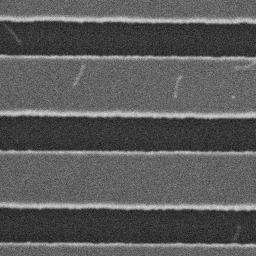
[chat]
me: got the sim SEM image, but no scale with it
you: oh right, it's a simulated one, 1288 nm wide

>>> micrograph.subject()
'lines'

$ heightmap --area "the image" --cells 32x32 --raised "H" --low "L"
HHHHHHHHHHHHHHHHHHHHHHHHHHHHHHHH
HHHHHHHHHHHHHHHHHHHHHHHHHHHHHHHH
LHHHHHHHHHHHHHHHHHHHHHHHHHHHHHHH
LLLLLLLLLLLLLLLLLLLLLLLLLLLLLLLL
LLLLLLLLLLLLLLLLLLLLLLLLLLLLLLLL
LLLLLLLLLLLLLLLLLLLLLLLLLLLLLLLL
LLLLLLLLLLLLLLLLLLLLLLLLLLLLLLLL
HHHHHHHHHHHHHHHHHHHHHHHHHHHHHHHH
HHHHHHHHHHHHHHHHHHHHHHHHHHHHHHHH
HHHHHHHHHHHHHHHHHHHHHHHHHHHHHHHH
HHHHHHHHHHHHHHHHHHHHHHHHHHHHHHHH
HHHHHHHHHHHHHHHHHHHHHHHHHHHHHHHH
HHHHHHHHHHHHHHHHHHHHHHHHHHHHHHHH
HHHHHHHHHHHHHHHHHHHHHHHHHHHHHHHH
LLLLLLLLLLLLLLLLLHLHHHHHHHHHHHHH
LLLLLLLLLLLLLLLLLLLLLLLLLLLLLLLL
LLLLLLLLLLLLLLLLLLLLLLLLLLLLLLLL
LLLLLLLLLLLLLLLLLLLLLLLLLLLLLLLL
LLLLLLLLLLLLLLLLLLLLLLLLLLLLLLLL
HHHHHHHHHHHHHHHHHHHHHHHHHHHHHHHH
HHHHHHHHHHHHHHHHHHHHHHHHHHHHHHHH
HHHHHHHHHHHHHHHHHHHHHHHHHHHHHHHH
HHHHHHHHHHHHHHHHHHHHHHHHHHHHHHHH
HHHHHHHHHHHHHHHHHHHHHHHHHHHHHHHH
HHHHHHHHHHHHHHHHHHHHHHHHHHHHHHHH
HHHHHHHHHHHHHHHHHHHHHHHHHHHHHHHH
LLLLLLLLLLLLLLLLLLLLLLLLLLLLLLLL
LLLLLLLLLLLLLLLLLLLLLLLLLLLLLLLL
LLLLLLLLLLLLLLLLLLLLLLLLLLLLLLLL
LLLLLLLLLLLLLLLLLLLLLLLLLLLLLLLL
HHHHHHHHHHHHHLHHLLLLLLHLLLLLLLLL
HHHHHHHHHHHHHHHHHHHHHHHHHHHHHHHH